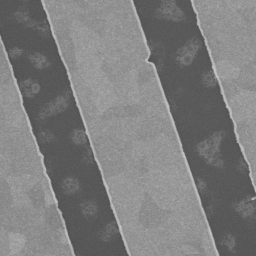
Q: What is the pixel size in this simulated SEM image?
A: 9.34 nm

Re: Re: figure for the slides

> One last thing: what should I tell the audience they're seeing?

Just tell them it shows one or a few lines or trenches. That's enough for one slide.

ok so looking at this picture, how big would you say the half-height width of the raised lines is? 782 nm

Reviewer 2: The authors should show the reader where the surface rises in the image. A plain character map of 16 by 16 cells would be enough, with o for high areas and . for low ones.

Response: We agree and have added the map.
...ooooo....oooo
...oooooo...oooo
...oooooo....ooo
....ooooo....ooo
o...oooooo...ooo
o....ooooo....oo
o....ooooo....oo
oo...oooooo....o
oo....ooooo....o
oo....ooooo....o
ooo...oooooo....
ooo....ooooo....
ooo....ooooo....
oooo...oooooo...
oooo....ooooo...
oooo....ooooo...